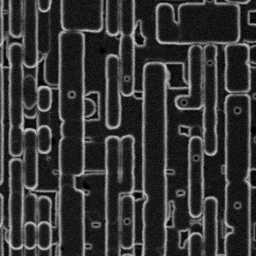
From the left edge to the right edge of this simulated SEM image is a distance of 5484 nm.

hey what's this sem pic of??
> wiring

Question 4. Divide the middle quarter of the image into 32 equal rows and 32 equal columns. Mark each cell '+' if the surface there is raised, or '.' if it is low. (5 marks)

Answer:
+++++......++++++...+++++......+
+++++......++++++...+++++......+
+++++......++++++...++++++.....+
+++++......++++.+...++++++.....+
+++++......++++++...+++++......+
+++++......++++++...+++++.......
+++++......++++++...+++++......+
+.+++......+++.++...+++++......+
+++++......+++......+++++...++++
+++++......+++......+++++...++++
+++++......+++......+++++...++++
+++++......+++......+++++.......
+++++......+++......+++++.......
+++++......+++......+++++.......
+++++......+++......+++++.......
+++++......+++......+++++.......
+++++...............+++++.......
+++++...............+++++.......
+++++......+++.++...+++++.......
+++++......++++++...+++++......+
+++++......++++++...++++++.....+
+++++......++++++...++++++.....+
+++++......++++++...++++++.....+
+++++......++++++...+++++......+
+++++......++++++...+++++......+
+++++......++++++...+++++......+
+++++......++++++...+++++......+
++++.......++++++...+++++......+
+++........++++++...+++++......+
+++........++++++...++++++.....+
+++........++++++...++++++.....+
++++.......++++++...++++++.....+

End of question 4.